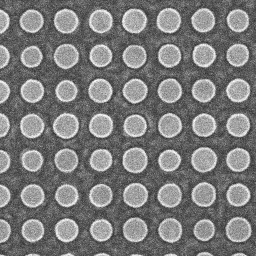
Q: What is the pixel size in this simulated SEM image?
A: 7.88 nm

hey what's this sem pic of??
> a regular array of raised bodies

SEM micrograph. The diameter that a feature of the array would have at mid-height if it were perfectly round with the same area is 175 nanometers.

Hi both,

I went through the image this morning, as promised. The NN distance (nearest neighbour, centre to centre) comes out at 0.269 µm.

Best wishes